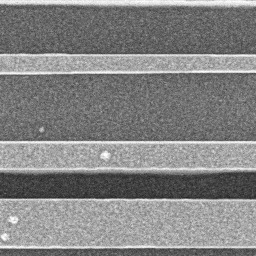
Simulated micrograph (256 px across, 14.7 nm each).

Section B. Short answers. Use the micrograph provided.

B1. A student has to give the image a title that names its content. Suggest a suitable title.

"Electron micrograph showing lines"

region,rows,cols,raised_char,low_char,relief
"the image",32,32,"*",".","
................................
................................
................................
................................
................................
................................
................................
********************************
********************************
................................
................................
................................
................................
................................
................................
................................
................................
................................
********************************
********************************
********************************
................................
................................
................................
................................
********************************
********************************
********************************
********************************
********************************
********************************
................................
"